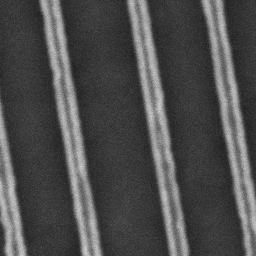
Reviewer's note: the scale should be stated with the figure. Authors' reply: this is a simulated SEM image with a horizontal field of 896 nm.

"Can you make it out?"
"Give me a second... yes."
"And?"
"one or a few lines or trenches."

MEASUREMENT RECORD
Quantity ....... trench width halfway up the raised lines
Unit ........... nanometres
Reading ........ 213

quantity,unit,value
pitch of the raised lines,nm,281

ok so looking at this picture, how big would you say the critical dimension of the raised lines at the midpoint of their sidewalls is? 50.1 nm